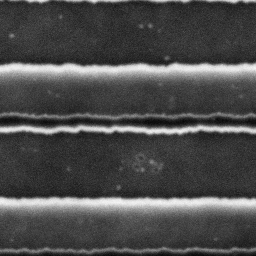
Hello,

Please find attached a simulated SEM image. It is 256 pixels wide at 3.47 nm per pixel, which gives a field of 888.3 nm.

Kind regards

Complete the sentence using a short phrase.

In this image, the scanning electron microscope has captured lines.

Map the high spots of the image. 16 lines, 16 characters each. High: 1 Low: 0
0000000000000000
0000000000000000
0000000000000000
0000000000000000
1111111111111111
1111111111111111
1111111111111111
1111111111111111
0000000000000000
0000000000000000
0000000000000000
0000000000000000
0000000000000000
1111111111111111
1111111111111111
1111111111111111